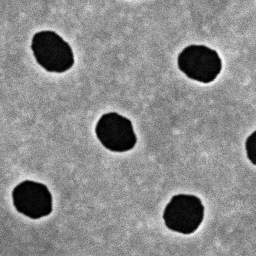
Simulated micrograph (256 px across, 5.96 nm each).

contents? holes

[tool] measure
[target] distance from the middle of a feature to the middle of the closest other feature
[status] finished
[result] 0.631 um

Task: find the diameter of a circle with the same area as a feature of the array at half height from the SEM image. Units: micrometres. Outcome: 0.244